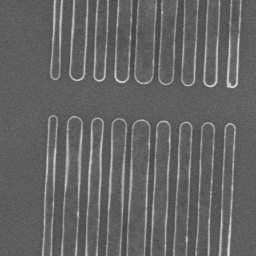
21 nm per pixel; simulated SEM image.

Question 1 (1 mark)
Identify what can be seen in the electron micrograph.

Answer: groups of lines, slits or small figures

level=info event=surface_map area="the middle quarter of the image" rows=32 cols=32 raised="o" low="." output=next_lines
..ooo...oo...ooo..oooo..ooo...oo
..ooo...oo...ooo..oooo..ooo...oo
..ooo...oo...ooo..oooo..ooo...oo
..ooo...oo...ooo..oooo..ooo..ooo
..............o....oo...ooo...oo
................................
................................
................................
................................
................................
................................
................................
................................
..oo............................
.ooo...ooo..ooo...ooo...oo......
.oooo..ooo..ooo..oooo..ooo...ooo
.ooo...ooo..ooo..oooo..ooo...ooo
.ooo...oo...ooo..oooo..ooo...ooo
.ooo...oo...ooo..oooo..ooo...ooo
.ooo...oo...ooo..oooo..ooo...ooo
.ooo...oo...ooo..oooo..ooo...ooo
.ooo...oo...ooo..oooo..ooo...ooo
.ooo...oo...ooo..oooo..ooo...ooo
.ooo...oo...ooo..oooo..ooo...ooo
.ooo...oo...ooo..oooo..ooo...ooo
.ooo...oo...ooo..oooo..ooo...oo.
.ooo...oo...ooo..oooo..ooo...oo.
.ooo...oo...ooo..oooo..ooo...oo.
.ooo..ooo...ooo..oooo..ooo...oo.
.ooo..ooo...ooo..oooo..ooo...oo.
.ooo..ooo...ooo..oooo..ooo..ooo.
oooo..ooo...ooo..oooo..ooo..ooo.